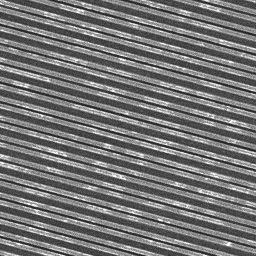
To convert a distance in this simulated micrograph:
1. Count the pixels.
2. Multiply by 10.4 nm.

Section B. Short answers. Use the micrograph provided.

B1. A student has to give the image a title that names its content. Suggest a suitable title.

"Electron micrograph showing parallel lines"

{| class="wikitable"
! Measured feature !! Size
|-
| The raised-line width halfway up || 4.47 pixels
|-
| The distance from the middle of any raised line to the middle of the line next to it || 96.7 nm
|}